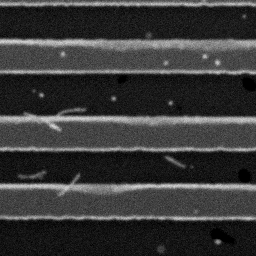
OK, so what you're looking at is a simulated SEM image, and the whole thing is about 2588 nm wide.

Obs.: lines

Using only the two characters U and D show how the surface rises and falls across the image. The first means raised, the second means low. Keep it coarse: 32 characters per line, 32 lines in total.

UUUUUUUUUUUUUUUUUUUUUUUUUUUUUUUU
DDDDDDDDDDDDDDDDDDDDDDDDDDDDDDDD
DDDDDDDDDDDDDDDDDDDDDDDDDDDDDDDD
DDDDDDDDDDDDDDDDDDDDDDDDDDDDDDDD
DDDDDDDDDDDDDDDDDDDDDDDDDDDDDDDD
UUUUUUUUUUUUUDDDDDDDDUUDDDDDDDDU
UUUUUUUUUUUUUUUUUUUUUUUUUUUUUUUU
UUUUUUUUUUUUUUUUUUUUUUUUUUUUUUUU
UUUUUUUUUUUUUUUUUUUUUUUUUUUUUUUU
DDDDDDDDDDDDDDDDDDDDDDDDDDDDDDDD
DDDDDDDDDDDDDDDDDDDDDDDDDDDDDDDD
DDDDDDDDDDDDDDDDDDDDDDDDDDDDDDDD
DDDDDDDDDDDDDDDDDDDDDDDDDDDDDDDD
DDDDDDDDDDDDDDDDDDDDDDDDDDDDDDDD
DDDDDDDDDDDDDDDDDDDDDDDDDDDDDDDD
UUUUUUUUUUUUUUUUUUUUUUUUUUUUUUUU
UUUUUUUUUUUUUUUUUUUUUUUUUUUUUUUU
UUUUUUUUUUUUUUUUUUUUUUUUUUUUUUUU
UUUUUUUUUUUUUUUUUUUUUUUUUUUUUUUU
DDDDDDDDDDDDDDDDDDDDDDDDDDDDDDDD
DDDDDDDDDDDDDDDDDDDDDDDDDDDDDDDD
DDDDDDDDDDDDDDDDDDDDDDDDDDDDDDDD
DDDDDDDDDDDDDDDDDDDDDDDDDDDDDDDD
UUUUUUUUUUDDDDDUUUUUUUUUUUUUUUUU
UUUUUUUUUUUUUUUUUUUUUUUUUUUUUUUU
UUUUUUUUUUUUUUUUUUUUUUUUUUUUUUUU
UUUUUUUUUUUUUUUUUUUUUUUUUUUUUUUU
DDDDDDDDDDDDDDDDDDDDDDDDDDDDDDDD
DDDDDDDDDDDDDDDDDDDDDDDDDDDDDDDD
DDDDDDDDDDDDDDDDDDDDDDDDDDDDDDDD
DDDDDDDDDDDDDDDDDDDDDDDDDDDDDDDD
DDDDDDDDDDDDDDDDDDDDDDDDDDDDDDDD